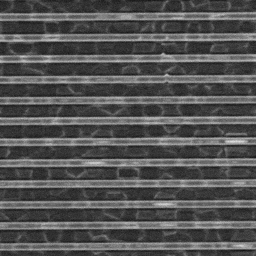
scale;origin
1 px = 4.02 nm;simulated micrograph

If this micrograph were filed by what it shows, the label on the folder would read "parallel lines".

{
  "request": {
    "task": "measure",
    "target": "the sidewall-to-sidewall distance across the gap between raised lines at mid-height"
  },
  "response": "13.9 pixels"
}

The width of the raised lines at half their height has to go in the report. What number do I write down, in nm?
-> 27.6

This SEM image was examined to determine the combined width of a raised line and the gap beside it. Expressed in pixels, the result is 20.9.